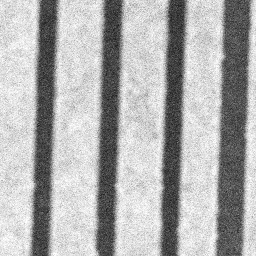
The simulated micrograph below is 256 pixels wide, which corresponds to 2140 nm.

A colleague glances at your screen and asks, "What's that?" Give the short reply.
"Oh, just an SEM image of one or a few lines or trenches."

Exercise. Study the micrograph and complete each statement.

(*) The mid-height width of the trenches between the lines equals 0.193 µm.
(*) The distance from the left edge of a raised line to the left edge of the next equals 519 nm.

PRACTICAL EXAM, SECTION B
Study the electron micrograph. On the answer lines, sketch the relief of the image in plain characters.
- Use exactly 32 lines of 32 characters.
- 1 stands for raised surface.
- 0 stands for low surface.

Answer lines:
11111000111110001111100011110000
11111000111110001111100111110000
11111001111110001111100111110000
11111001111110001111100011100000
11110001111100001111100111100000
11110001111100001111100111100001
11110001111100011111000111110001
11110001111100011111100111100000
11110001111100011111000111100001
11110001111100011111000111100001
11110001111100011111000111100001
11110001111100011111000111100001
11110001111100011111000111100001
11110001111100011111000111100001
11110001111100011111000111100001
11110001111100011111000111100001
11110001111100011111000111100001
11110001111100011111000111100001
11110001111100011111000111100001
11110001111100011111000111100001
11110001111100011111000111100001
11110001111100011111000111100001
11110001111100011111000111100001
11110001111100011111000111100001
11110001111100011111000111100001
11110001111100011111000111100001
11110001111100011111000111100001
11110001111100011111000111100001
11110001111100011111000111100001
11110001111100011111000111100001
11110001111100011111000111100001
11110001111100011111000111100001